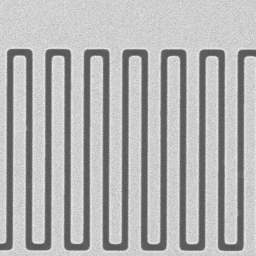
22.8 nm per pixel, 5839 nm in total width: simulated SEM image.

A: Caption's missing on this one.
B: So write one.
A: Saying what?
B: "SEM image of groups of lines, slits or small figures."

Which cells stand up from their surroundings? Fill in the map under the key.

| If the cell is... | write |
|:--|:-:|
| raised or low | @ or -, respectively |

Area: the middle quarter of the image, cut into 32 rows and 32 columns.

--@@@--@@@--@@--@@@--@@@--@@@--@
--@@@--@@@--@@--@@@--@@@--@@@--@
--@@@--@@@--@@--@@@--@@@--@@@--@
--@@@--@@@--@@--@@@--@@@--@@@--@
--@@@--@@@--@@--@@@--@@@--@@@--@
--@@@--@@@--@@--@@@--@@@--@@@--@
--@@@--@@@--@@--@@@--@@@--@@@--@
--@@@--@@@--@@--@@@--@@@--@@@--@
--@@@--@@@--@@--@@@--@@@--@@@--@
--@@@--@@@--@@--@@@--@@@--@@@--@
--@@@--@@@--@@--@@@--@@@--@@@--@
--@@@--@@@--@@--@@@--@@@--@@@--@
--@@@--@@@--@@--@@@--@@@--@@@--@
--@@@--@@@--@@--@@@--@@@--@@@--@
--@@@--@@@--@@--@@@--@@@--@@@--@
--@@@--@@@--@@--@@@--@@@--@@@--@
--@@@--@@@--@@--@@@--@@@--@@@--@
--@@@--@@@--@@--@@@--@@@--@@@--@
--@@@--@@@--@@--@@@--@@@--@@@--@
--@@@--@@@--@@--@@@--@@@--@@@--@
--@@@--@@@--@@--@@@--@@@--@@@--@
--@@@--@@@--@@--@@@--@@@--@@@--@
--@@@--@@@-@@@--@@@--@@@--@@@--@
--@@@--@@@-@@@--@@@--@@@--@@@--@
--@@@--@@@-@@@--@@@--@@@--@@@--@
--@@@--@@@-@@@--@@@--@@@--@@@--@
--@@@--@@@-@@@--@@@--@@@--@@@--@
--@@@--@@@-@@@--@@@--@@@--@@@--@
--@@@--@@@-@@@--@@@--@@@--@@@--@
--@@@--@@@-@@@--@@@--@@@--@@@--@
--@@@--@@@-@@@--@@@--@@@--@@@--@
--@@@--@@@-@@@--@@@--@@@--@@@--@